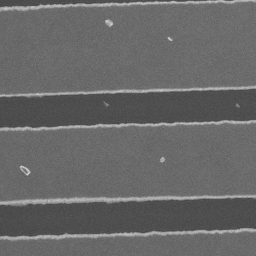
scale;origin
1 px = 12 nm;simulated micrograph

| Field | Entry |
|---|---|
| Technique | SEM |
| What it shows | lines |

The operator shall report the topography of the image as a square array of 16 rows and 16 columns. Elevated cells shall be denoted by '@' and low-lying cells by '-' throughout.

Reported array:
@@@@@@@@@@@@@@@@
@@@@@@@@@@@@@@@@
@@@@@@@@@@@@@@@@
@@@@@@@@@@@@@@@@
@@@@@@@@@@@@@@@@
@@@@@@@@@@@@@@@@
----------------
----------------
@@@@@@@@@@@@@@@@
@@@@@@@@@@@@@@@@
@@@@@@@@@@@@@@@@
@@@@@@@@@@@@@@@@
@@@@@@@@@-------
----------------
-----------@@@@@
@@@@@@@@@@@@@@@@